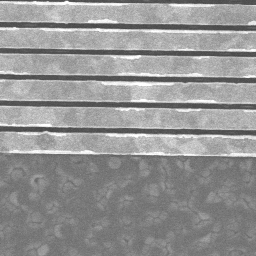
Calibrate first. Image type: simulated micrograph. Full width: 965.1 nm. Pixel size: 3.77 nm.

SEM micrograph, parallel lines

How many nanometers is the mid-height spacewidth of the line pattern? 22.2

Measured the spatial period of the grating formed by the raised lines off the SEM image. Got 98.7 nm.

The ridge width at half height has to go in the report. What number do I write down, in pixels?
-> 20.4